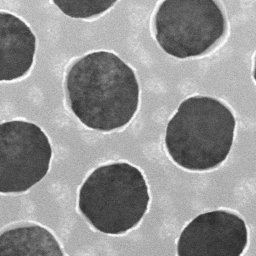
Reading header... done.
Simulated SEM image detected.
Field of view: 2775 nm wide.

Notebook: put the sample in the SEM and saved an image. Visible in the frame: holes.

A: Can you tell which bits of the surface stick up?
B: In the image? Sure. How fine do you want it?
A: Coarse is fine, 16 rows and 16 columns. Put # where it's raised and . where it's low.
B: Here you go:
####...###....##
..########....##
..########....##
..###..####.####
..##....########
####.....#######
####.....##...##
#####...###....#
...#######.....#
...########...##
...###..####.###
..###....#######
#####....#######
#####....###...#
...###..###....#
....#######....#